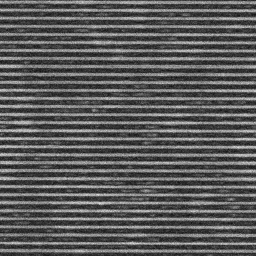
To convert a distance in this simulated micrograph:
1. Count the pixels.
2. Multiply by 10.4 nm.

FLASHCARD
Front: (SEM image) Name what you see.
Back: parallel lines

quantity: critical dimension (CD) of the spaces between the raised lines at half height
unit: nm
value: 60.1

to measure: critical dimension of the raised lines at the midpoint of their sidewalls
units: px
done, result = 2.37